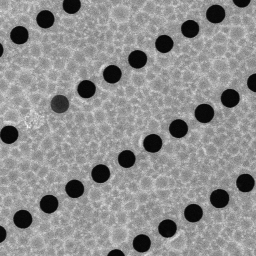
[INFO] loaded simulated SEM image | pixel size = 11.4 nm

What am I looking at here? a regular array of holes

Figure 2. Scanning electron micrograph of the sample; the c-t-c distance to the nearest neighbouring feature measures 340 nanometers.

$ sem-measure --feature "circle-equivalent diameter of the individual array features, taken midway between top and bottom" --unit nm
215